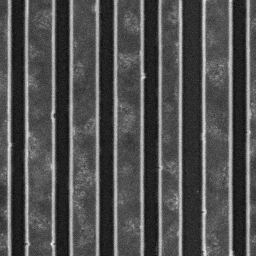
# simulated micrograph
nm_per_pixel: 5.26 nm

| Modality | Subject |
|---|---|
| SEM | parallel lines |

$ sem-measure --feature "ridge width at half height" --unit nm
144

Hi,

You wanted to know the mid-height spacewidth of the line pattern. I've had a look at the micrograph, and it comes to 88.7 nanometers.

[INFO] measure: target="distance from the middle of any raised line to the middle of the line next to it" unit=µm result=0.233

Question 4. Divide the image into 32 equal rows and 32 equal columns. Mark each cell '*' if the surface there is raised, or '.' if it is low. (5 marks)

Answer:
*..****..***...***..***...***..*
*..****..***...***..***...***..*
*..****..***...***..***...***..*
*..****..***...***..***...***..*
*..****..***...***..***...***..*
*..****..***...***..***...***..*
*..****..***...***..***...***..*
*..****..***...***..***...***..*
*..****..***...***..***...***..*
*..****..***..****..***...***..*
*..****..***..****..***...***..*
*..****..***...***..***...***..*
*..****..***...***..***...***..*
*..****..***...***..***...***..*
*..****..***...***..***...***..*
*..****..***...***..***...***..*
*..****..***...***..***..****..*
*..****..***...***..***..****..*
*..****..***...***..***...***..*
*..****..***..****..***...***..*
*..****..***..****..***...***..*
*..****..***..****..***...***..*
*..****..***...***..***...***..*
*..****..***...***..***...***..*
*..****..***...***..***...***..*
*..****..***...***..***...***..*
*..****..***..****..***...***..*
*..****..***...***..***...***..*
*..****..***...***..***...***..*
*..****..***...***..***...***..*
*..****..***...***..***...***..*
*..****..***...***..***...***..*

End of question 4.